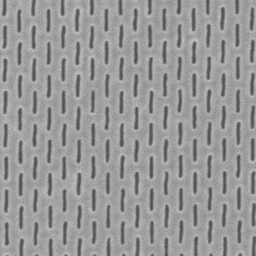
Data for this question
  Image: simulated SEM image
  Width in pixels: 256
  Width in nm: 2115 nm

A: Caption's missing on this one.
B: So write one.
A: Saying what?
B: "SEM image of a regular array of holes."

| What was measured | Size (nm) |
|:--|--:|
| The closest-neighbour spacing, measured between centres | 176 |